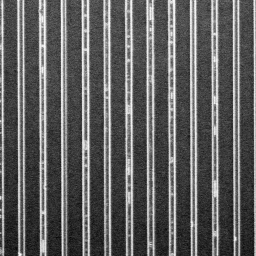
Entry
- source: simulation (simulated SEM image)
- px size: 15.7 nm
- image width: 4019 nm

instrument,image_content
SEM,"parallel lines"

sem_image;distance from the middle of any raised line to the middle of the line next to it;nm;338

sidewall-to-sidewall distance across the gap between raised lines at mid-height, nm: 251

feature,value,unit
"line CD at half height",78.5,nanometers